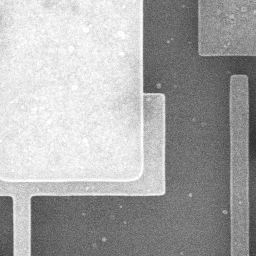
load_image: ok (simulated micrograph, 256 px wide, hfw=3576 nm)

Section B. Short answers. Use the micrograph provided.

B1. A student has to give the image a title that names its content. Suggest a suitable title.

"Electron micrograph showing wiring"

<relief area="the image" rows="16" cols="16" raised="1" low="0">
1111111110000000
1111111110000000
1111111110000000
1111111110000000
1111111110000000
1111111110000000
1111111110000000
1111111110000000
1111111110000000
1111111110000000
1111111110000000
0000000000000000
0000000000000000
0000000000000000
0000000000000000
0000000000000000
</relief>